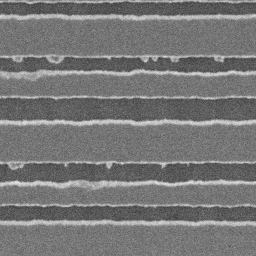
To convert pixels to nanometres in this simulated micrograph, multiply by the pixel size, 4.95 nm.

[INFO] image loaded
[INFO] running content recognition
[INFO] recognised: lines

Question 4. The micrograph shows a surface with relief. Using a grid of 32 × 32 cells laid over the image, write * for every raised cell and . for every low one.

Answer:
................................
................................
********************************
********************************
********************************
********************************
********************************
................................
................................
********************************
********************************
********************************
................................
................................
................................
********************************
********************************
********************************
********************************
********************************
.*..............................
................................
................................
********************************
********************************
********************************
................................
................................
********************************
********************************
********************************
********************************